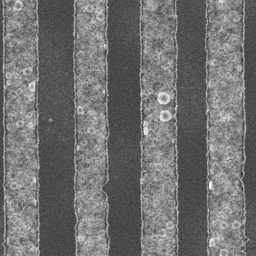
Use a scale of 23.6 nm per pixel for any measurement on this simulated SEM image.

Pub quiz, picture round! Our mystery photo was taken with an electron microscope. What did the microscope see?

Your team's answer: one or a few lines or trenches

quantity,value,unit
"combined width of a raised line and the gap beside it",1600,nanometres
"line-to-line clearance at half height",792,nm